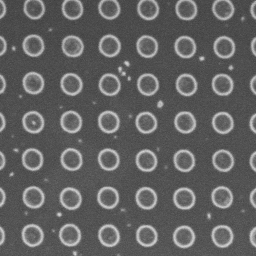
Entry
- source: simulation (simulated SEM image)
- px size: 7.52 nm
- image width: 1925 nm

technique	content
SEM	a regular array of raised bodies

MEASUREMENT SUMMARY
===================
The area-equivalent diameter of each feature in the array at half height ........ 20.1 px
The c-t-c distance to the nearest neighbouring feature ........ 0.28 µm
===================